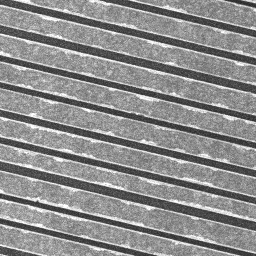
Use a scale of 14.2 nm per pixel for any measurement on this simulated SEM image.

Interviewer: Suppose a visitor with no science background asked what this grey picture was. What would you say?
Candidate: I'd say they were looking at parallel lines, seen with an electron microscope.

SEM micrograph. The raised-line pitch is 383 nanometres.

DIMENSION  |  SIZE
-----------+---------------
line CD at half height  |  266 nm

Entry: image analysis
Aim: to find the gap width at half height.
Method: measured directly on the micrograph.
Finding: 107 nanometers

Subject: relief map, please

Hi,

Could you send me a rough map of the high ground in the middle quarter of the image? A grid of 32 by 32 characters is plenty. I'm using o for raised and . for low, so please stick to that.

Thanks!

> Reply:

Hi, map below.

ooooooooooooooooo...........oooo
ooooooooooooooooooooo...........
.....ooooooooooooooooooooo......
.........ooooooooooooooooooooo..
ooooo........ooooooooooooooooooo
ooooooooo........ooooooooooooooo
ooooooooooooo.........oooooooooo
ooooooooooooooooo.........oooooo
..oooooooooooooooooooo........oo
......oooooooooooooooooooo......
ooo.......oooooooooooooooooooo..
ooooooo.......oooooooooooooooooo
ooooooooooo........ooooooooooooo
ooooooooooooooo........ooooooooo
ooooooooooooooooooo........ooooo
...ooooooooooooooooooooo.......o
.......ooooooooooooooooooooo....
oo.........ooooooooooooooooooooo
oooooo.........ooooooooooooooooo
oooooooooo.........ooooooooooooo
oooooooooooooo..........oooooooo
oooooooooooooooooo.........ooooo
...oooooooooooooooooooo........o
.......oooooooooooooooooooo.....
ooo........oooooooooooooooooooo.
ooooooo........ooooooooooooooooo
ooooooooooo........ooooooooooooo
ooooooooooooooo.........oooooooo
...oooooooooooooooo.........oooo
.......ooooooooooooooooo........
...........ooooooooooooooooo....
oooo...........ooooooooooooooooo